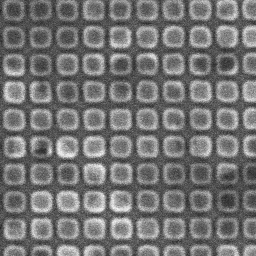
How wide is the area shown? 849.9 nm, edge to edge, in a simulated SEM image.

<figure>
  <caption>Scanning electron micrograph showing a regular array of raised bodies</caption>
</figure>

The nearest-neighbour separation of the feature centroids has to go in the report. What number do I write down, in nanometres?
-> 87.7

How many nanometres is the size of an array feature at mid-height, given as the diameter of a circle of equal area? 70.1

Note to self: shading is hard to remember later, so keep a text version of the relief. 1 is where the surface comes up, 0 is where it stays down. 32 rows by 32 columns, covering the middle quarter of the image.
11100111110011111011111001111101
11100111110011111001111001111100
00000000000000000000000000000000
00000000000000000000000000000000
00000000000000100000110000000000
11100111110011111011111001111100
11100111110011111001111001111100
11100111110011111011111001111100
11100111110011110011111001111100
00000000000000000000000000000000
00000000000000000000000000000000
00000000000000000000000000010000
11100111110011111001111001111100
11100111110011111011111001111100
11100111110011111001111001111100
11100011110011111001111001111100
00000000000000000000000000000000
00000000000000000000000000000000
11000011100011110001111000111000
11100111110011110001111001111100
11100111110011111001111001111100
11100111110011111001111001111100
11100011110011110001111001111100
00000000000000000000000000000000
00000000000000000000000000000000
11100111100011110001111000111000
11100111110011111001111001111100
11100111110011111001111001111100
11100111110011111001111001111100
11100011110001110001111000111100
00000000000000000000000000000000
00000000000000000000000000000000